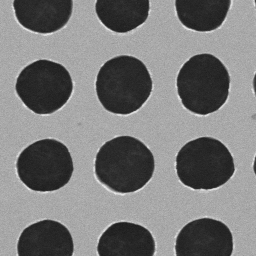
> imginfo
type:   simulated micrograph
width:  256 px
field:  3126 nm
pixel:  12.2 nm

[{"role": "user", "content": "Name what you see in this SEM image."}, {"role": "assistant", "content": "holes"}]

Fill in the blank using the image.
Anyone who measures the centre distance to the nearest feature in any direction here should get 965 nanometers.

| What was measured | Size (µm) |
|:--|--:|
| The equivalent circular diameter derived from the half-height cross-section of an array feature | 0.685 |